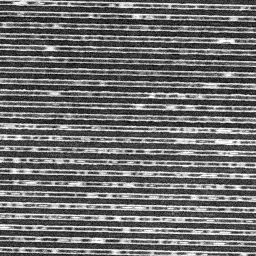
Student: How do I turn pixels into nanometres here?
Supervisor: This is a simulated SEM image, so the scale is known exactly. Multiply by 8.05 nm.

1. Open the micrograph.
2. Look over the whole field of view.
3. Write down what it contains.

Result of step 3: parallel lines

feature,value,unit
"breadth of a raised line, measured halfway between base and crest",0.0412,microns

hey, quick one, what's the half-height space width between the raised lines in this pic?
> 6.12 pixels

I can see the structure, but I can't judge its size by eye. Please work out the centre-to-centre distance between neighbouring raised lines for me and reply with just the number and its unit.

90.5 nanometers